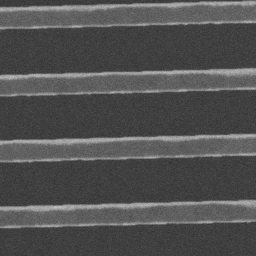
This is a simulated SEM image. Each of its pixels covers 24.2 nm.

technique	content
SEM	lines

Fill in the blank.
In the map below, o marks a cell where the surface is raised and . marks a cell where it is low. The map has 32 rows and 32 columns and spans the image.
.................ooooooooooooooo
oooooooooooooooooooooooooooooooo
oooooooooooooooooooooooooooooooo
................................
................................
................................
................................
................................
................................
.ooooooooooooooooooooooooooooooo
oooooooooooooooooooooooooooooooo
ooooooooooooooo.................
................................
................................
................................
................................
................................
........oooooooooooooooooooooooo
oooooooooooooooooooooooooooooooo
ooooooooooooooooooooooo.........
................................
................................
................................
................................
................................
..................oooooooooooooo
oooooooooooooooooooooooooooooooo
oooooooooooooooooooooooooooooooo
................................
................................
................................
................................